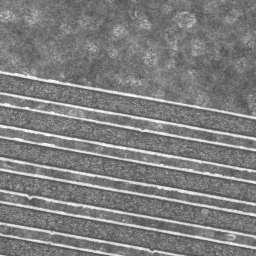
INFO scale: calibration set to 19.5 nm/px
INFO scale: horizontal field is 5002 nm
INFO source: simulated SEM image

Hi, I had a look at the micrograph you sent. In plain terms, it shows parallel lines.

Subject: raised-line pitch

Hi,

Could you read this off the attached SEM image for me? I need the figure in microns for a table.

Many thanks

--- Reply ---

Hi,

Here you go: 0.626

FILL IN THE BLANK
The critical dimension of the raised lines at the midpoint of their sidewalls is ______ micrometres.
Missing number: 0.228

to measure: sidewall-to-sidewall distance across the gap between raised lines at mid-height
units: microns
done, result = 0.401